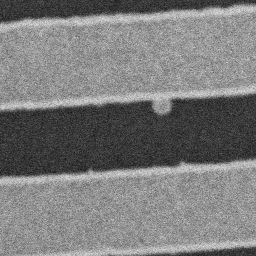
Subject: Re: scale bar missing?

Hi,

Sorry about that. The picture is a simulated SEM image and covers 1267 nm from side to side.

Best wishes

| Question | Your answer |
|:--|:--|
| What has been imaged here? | one or a few lines or trenches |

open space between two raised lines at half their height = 367 nm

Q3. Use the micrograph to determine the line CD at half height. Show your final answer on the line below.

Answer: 396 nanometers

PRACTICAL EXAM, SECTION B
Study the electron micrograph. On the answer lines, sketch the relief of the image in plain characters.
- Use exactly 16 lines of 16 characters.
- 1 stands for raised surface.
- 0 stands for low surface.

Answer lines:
0000000000000000
0111111111111111
1111111111111111
1111111111111111
1111111111111111
1111111111111111
1111000000000000
0000000000000000
0000000000000000
0000000000000000
0000000000001111
1111111111111111
1111111111111111
1111111111111111
1111111111111111
1111111111110000